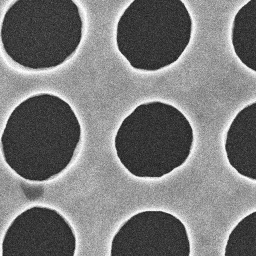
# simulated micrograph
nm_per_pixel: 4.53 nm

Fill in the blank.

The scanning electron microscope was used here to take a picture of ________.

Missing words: holes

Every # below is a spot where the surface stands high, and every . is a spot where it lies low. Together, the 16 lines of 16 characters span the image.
#....###....###.
.....##.....###.
.....##.....###.
#...####...####.
################
################
#...#####.######
#....###....###.
.....##.....##..
.....##.....##..
#...####...####.
################
################
#...####...####.
.....##.....##..
.....##.....##..